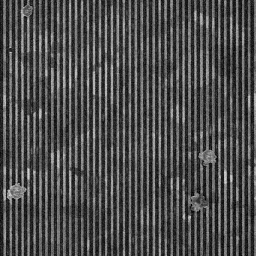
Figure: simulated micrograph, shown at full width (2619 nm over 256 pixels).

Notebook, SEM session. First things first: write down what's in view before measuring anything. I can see parallel lines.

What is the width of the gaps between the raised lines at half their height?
46 nanometers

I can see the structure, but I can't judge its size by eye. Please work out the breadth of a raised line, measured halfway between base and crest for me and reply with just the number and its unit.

15.3 nm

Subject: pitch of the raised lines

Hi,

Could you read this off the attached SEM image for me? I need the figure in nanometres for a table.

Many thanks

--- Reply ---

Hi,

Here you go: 61